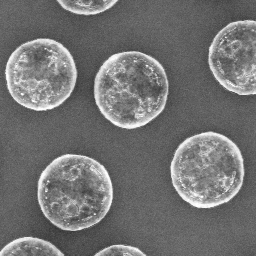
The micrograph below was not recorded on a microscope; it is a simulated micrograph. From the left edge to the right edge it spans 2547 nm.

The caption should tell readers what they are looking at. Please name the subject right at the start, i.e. raised bodies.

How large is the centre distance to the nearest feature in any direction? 1.01 microns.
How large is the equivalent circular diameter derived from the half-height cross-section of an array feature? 0.725 um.